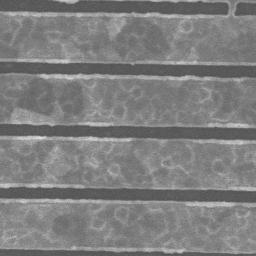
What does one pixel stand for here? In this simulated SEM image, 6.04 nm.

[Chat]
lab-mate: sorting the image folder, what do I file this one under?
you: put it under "one or a few lines or trenches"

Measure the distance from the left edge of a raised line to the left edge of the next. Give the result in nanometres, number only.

377